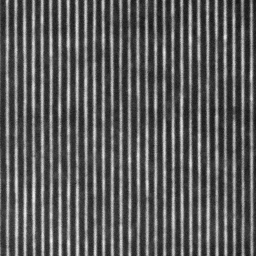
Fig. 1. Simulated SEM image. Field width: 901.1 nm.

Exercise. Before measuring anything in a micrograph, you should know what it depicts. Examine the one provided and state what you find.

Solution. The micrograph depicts parallel lines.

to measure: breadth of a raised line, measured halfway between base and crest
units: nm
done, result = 4.8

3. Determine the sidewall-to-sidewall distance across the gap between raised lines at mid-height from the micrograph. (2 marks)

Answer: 26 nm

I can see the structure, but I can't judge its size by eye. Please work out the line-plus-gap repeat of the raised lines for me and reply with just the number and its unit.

0.0307 microns